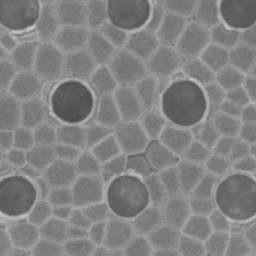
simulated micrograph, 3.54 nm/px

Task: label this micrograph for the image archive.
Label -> holes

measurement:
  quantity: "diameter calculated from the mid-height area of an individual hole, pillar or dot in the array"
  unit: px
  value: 42.6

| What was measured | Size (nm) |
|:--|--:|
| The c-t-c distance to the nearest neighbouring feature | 193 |